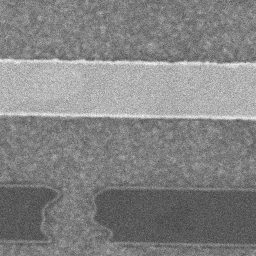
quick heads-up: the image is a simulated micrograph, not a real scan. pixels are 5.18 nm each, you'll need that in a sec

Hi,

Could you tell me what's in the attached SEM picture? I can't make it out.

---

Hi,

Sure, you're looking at one or a few lines or trenches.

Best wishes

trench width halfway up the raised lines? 371 nm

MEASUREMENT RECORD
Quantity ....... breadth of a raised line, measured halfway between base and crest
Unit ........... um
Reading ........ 0.277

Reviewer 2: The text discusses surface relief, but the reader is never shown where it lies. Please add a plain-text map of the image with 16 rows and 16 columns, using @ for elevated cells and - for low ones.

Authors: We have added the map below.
----------------
----------------
----------------
----------------
@@@@@@@@@@@@@@@@
@@@@@@@@@@@@@@@@
@@@@@@@@@@@@@@@@
----------------
----------------
----------------
----------------
----------------
@@@---@@@@@@@@@@
@@@---@@@@@@@@@@
@@@----@@@@@@@@@
----------------